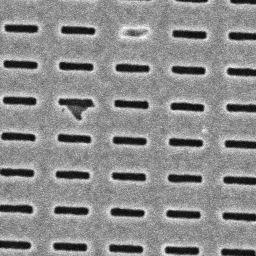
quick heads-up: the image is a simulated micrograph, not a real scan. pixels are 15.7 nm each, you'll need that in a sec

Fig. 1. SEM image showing a regular array of holes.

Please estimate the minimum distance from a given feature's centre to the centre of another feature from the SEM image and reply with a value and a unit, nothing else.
565 nm